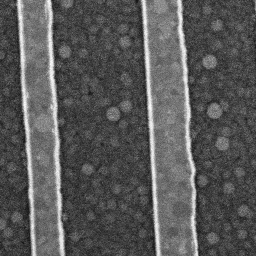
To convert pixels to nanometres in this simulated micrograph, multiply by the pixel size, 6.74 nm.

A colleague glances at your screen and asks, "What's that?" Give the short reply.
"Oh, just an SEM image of one or a few lines or trenches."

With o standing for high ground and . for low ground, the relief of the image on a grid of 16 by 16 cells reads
.oo......oo.....
.oo......oo.....
.oo......oo.....
.oo......oo.....
.oo......ooo....
.oo......ooo....
..o......ooo....
..o......ooo....
..oo.....ooo....
..oo......oo....
..oo......oo....
..oo......oo....
..oo......oo....
..oo......oo....
..oo......oo....
..oo......oo....